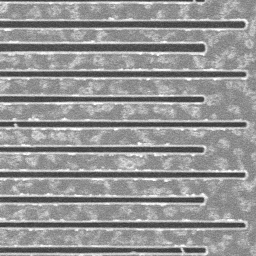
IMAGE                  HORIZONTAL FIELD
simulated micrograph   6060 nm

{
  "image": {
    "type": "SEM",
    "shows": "parallel lines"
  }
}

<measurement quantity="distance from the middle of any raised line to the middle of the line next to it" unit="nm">596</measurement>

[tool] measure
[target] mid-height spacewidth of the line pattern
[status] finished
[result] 0.163 um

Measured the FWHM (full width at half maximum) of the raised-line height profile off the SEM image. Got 441 nm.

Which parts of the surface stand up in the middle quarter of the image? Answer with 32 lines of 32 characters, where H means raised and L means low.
HHHHHHHHHHHHHHHHHHHHHHHHHHHHHHHH
HHHHLLLLLLLLLLLHHLLLLLLLLLLLLLLL
LLLLLLLLLLLLLLLLLLLLLLLLLLLLLLLL
HHHHHHHLLLLLLLLHHHHHLLLLLLLLLLLL
HHHHHHHHHHHHHHHHHHHHHHHHHHHHHHHH
HHHHHHHHHHHHHHHHHHHHHHHHHHHHHHHH
HHHHHHHHHHHHHHHHHHHHHHHHHHHHHHHH
HHHHHHHHHHHHHHHHHHHHHHHHHHHHHHHH
LLLLLLLLLLLLLLLLLLLLLLLLLLLLLLLL
LLLLLLLLLLLLLLLLLLLLLLLLLLLLLLLL
HHHHHHHHHHHHHHHHHHHHHHHHHHHHHHHH
HHHHHHHHHHHHHHHHHHHHHHHHHHHHHHHH
HHHHHHHHHHHHHHHHHHHHHHHHHHHHHHHH
HHHHHHHHHHHHHHHHHHHHHHHHHHHHHHHH
LLLLLLLLLLLLLLLLLLLLLLLLLLLLLLLL
LLLLLLLLLLLLLLLLLLLLLLLLLLLLLLLL
HHHHHHHHHHHHHHHHHHHHHHHHHHHHHHHH
HHHHHHHHHHHHHHHHHHHHHHHHHHHHHHHH
HHHHHHHHHHHHHHHHHHHHHHHHHHHHHHHH
HHHHHHHHHHHHHHHHHHHHHHHHHHHHHHHH
LLLLLLLLLLLLLLLLLLLLLLLLLLLLLLLL
LLLLLLLLLLLLLLLLLLLLLLLLLLLLLLLL
HHHHHHHHHHHHHHHHHHHHHHHHHHHHHHHH
HHHHHHHHHHHHHHHHHHHHHHHHHHHHHHHH
HHHHHHHHHHHHHHHHHHHHHHHHHHHHHHHH
HHHHHHHHHHHHHHHHHHHHHHHHHHHHHHHH
HHHHHHHHHHHHHHHHHHHHHHHHHHHHHHHH
LLLLLLLLLLLLLLLLLLLLLLLLLLLLLLLL
LLLLLLLLLLLLLLLLLLLLLLLLLLLLLLLL
HHHHHHHHHHHHHHHHHHHHHHHHHHHHHHHH
HHHHHHHHHHHHHHHHHHHHHHHHHHHHHHHH
HHHHHHHHHHHHHHHHHHHHHHHHHHHHHHHH